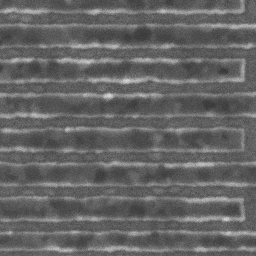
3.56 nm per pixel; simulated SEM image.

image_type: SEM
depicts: parallel lines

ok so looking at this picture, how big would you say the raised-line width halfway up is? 79.3 nm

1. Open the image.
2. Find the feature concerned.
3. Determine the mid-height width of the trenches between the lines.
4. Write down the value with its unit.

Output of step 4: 11.6 pixels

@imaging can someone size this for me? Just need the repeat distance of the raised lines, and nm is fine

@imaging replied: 122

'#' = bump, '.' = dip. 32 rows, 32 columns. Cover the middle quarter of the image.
################################
################################
################################
################################
.......#...########......#######
................................
................................
.....###..####...##..#..........
################################
################################
################################
################################
################################
................................
................................
................................
#########################.######
################################
################################
################################
################################
################################
................................
................................
............##..................
################################
################################
################################
################################
################################
................................
................................